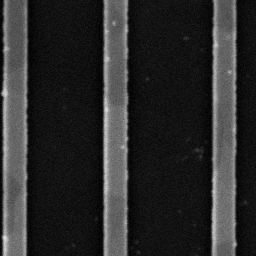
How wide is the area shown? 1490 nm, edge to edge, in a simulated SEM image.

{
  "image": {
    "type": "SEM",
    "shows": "lines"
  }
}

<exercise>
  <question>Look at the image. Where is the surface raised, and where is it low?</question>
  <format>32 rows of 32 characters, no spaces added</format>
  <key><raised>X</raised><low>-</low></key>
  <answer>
-XX----------XXX-----------XX---
-XX----------XXX-----------XX---
-XX----------XXX-----------XX---
-XX----------XXX-----------XX---
XXX----------XXX-----------XX---
-XX----------XXX-----------XX---
-XX----------XXX-----------XX---
-XX----------XXX-----------XX---
-XX----------XXX-----------XX---
-XX----------XXX-----------XX---
XXX----------XXX-----------XX---
XXX----------XXX-----------XX---
XXX----------XXX-----------XX---
XXX----------XXX-----------XX---
XXX----------XXX-----------XX---
XXX----------XXX-----------XX---
XXX----------XXX-----------XX---
-XX----------XXX-----------XX---
XXX----------XXX-----------XX---
XXX----------XXX-----------XX---
XXX----------XXX-----------XX---
XXX----------XXX-----------XX---
XXX----------XXX-----------XX---
XXX----------XXX-----------XX---
XXX----------XXX-----------XX---
XXX----------XXX-----------XX---
XXX----------XXX-----------XX---
XXX----------XXX-----------XX---
XXX----------XXX-----------XX---
XXX----------XXX-----------XX---
XXX----------XXX-----------XX---
XXX----------XXX-----------XX---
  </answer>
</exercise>